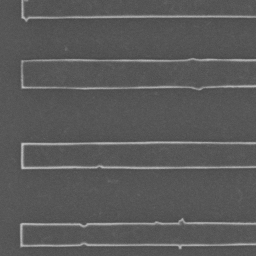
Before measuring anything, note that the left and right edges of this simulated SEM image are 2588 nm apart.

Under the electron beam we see one or a few lines or trenches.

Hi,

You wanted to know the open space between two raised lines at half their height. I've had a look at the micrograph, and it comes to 0.551 µm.